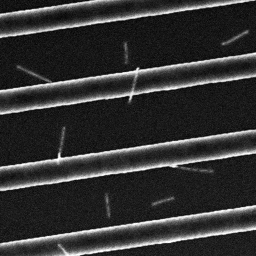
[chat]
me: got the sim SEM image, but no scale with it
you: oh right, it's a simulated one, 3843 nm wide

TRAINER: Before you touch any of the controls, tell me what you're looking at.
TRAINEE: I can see lines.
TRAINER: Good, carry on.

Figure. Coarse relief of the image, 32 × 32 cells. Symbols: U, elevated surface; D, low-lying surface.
DDDDDDDDDUUUUUUUUUUUUUUUUUUUDDDD
DDUUUUUUUUUUUUUUUUUUUUDDDDDDDDDD
UUUUUUUUUUUUUUUDDDDDDDDDDDDDDDDD
UUUUUUUUDDDDDDDDDDDDDDDDDDDDDDDD
UDDDDDDDDDDDDDDDDDDDDDDDDDDDDDDD
DDDDDDDDDDDDDDDDDDDDDDDDDDDDDDDD
DDDDDDDDDDDDDDDDDDDDDDDDDDDDDDDD
DDDDDDDDDDDDDDDDDDDDDDDDDDUUUUUU
DDDDDDDDDDDDDDDDDDDDUUUUUUUUUUUU
DDDDDDDDDDDDDUUUUUUUUUUUUUUUUUUU
DDDDDDUUUUUUUUUUUUUUUUUUUDDDDDDD
UUUUUUUUUUUUUUUUUUUDDDDDDDDDDDDD
UUUUUUUUUUUUDDDDDDDDDDDDDDDDDDDD
UUUUUDDDDDDDDDDDDDDDDDDDDDDDDDDD
DDDDDDDDDDDDDDDDDDDDDDDDDDDDDDDD
DDDDDDDDDDDDDDDDDDDDDDDDDDDDDDDD
DDDDDDDDDDDDDDDDDDDDDDDDDDDDDDUU
DDDDDDDDDDDDDDDDDDDDDDDUUUUUUUUU
DDDDDDDDDDDDDDDDDUUUUUUUUUUUUUUU
DDDDDDDDDDUUUUUUUUUUUUUUUUUUUDDD
DDDUUUUUUUUUUUUUUUUUUUUDDDDDDDDD
UUUUUUUUUUUUUUUUDDDDDDDDDDDDDDDD
UUUUUUUUUDDDDDDDDDDDDDDDDDDDDDDD
UUUDDDDDDDDDDDDDDDDDDDDDDDDDDDDD
DDDDDDDDDDDDDDDDDDDDDDDDDDDDDDDD
DDDDDDDDDDDDDDDDDDDDDDDDDDDDDDDD
DDDDDDDDDDDDDDDDDDDDDDDDDDDUUUUU
DDDDDDDDDDDDDDDDDDDDUUUUUUUUUUUU
DDDDDDDDDDDDDUUUUUUUUUUUUUUUUUUU
DDDDDDUUUUUUUUUUUUUUUUUUUUDDDDDD
UUUUUUUUUUUUUUUUUUUUDDDDDDDDDDDD
UUUUUUUUUUUUDDDDDDDDDDDDDDDDDDDD